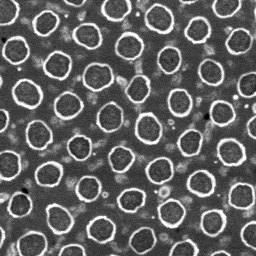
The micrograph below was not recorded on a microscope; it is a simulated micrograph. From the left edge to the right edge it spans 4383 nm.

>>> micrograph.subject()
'a regular array of holes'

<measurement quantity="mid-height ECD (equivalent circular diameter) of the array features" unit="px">23.3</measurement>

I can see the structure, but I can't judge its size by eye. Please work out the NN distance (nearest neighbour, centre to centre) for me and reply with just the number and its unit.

40.9 pixels